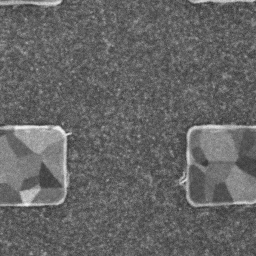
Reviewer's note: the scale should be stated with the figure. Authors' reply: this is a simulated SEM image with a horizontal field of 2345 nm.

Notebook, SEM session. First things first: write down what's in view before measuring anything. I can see raised bodies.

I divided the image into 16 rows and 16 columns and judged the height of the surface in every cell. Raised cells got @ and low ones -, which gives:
----------------
----------------
----------------
----------------
----------------
----------------
----------------
----------------
@@@@--------@@@@
@@@@--------@@@@
@@@@--------@@@@
@@@@--------@@@@
@@@@--------@@@@
----------------
----------------
----------------